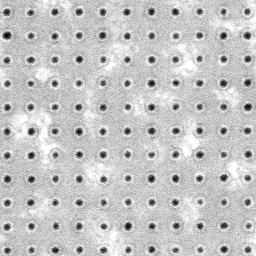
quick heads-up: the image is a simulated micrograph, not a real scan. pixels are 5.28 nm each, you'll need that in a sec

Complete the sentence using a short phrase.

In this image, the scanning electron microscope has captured a regular array of raised bodies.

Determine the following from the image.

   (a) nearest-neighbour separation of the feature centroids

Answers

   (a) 23.5 px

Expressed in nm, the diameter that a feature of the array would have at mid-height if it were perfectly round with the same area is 56.5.